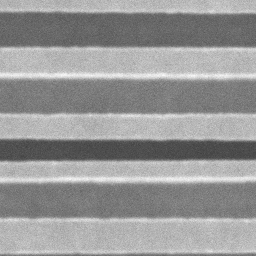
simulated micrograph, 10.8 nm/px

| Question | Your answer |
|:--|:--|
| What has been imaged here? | lines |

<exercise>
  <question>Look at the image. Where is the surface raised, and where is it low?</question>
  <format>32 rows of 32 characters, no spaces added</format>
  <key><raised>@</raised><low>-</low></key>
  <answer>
@@@@@@@@@@@@@@@@@@@@@@@@@@@@@@@@
---------------------@--@@@@@@@@
--------------------------------
--------------------------------
--------------------------------
--------------------------------
@@@@@@@@@@@@@@@@@@@@@@@@@@@@@@@@
@@@@@@@@@@@@@@@@@@@@@@@@@@@@@@@@
@@@@@@@@@@@@@@@@@@@@@@@@@@@@@@@@
--------------------------------
--------------------------------
--------------------------------
--------------------------------
--------------------------------
@@@@@@@@@@@@@@@@@@@@@@@@@@@@@@@@
@@@@@@@@@@@@@@@@@@@@@@@@@@@@@@@@
@@@@@@@@@@@@@@@@@@@@@@@@@@@@@@@@
--------------------------------
--------------------------------
--------------------------------
@@@@@@@@@@@@@@@@@@@@@@@@@@@@@@@@
@@@@@@@@@@@@@@@@@@@@@@@@@@@@@@@@
--------------------------------
--------------------------------
--------------------------------
--------------------------------
--------------------------------
@@@@@@@@@@@@@@@@@@@@@@@@@@@@@@@@
@@@@@@@@@@@@@@@@@@@@@@@@@@@@@@@@
@@@@@@@@@@@@@@@@@@@@@@@@@@@@@@@@
@@@@@@@@@@@@@@@@@@@@@@@@@@@@@@@@
@@@@@@@@@@@@@@@@@@@@@@@@@@@@@@@-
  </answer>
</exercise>